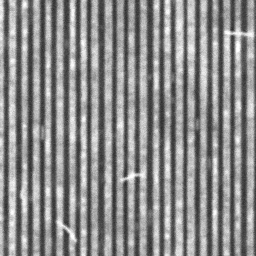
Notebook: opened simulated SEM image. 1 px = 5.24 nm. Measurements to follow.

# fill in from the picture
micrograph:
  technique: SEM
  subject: parallel lines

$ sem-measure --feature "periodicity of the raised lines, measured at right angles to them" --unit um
0.0624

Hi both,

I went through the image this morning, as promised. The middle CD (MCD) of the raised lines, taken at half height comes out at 5.63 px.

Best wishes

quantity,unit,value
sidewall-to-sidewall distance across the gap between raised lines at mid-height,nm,34.7